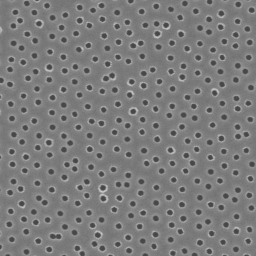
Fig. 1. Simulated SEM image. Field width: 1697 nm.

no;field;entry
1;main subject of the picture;a regular array of holes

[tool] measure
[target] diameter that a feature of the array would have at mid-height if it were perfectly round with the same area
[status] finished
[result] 36.6 nanometers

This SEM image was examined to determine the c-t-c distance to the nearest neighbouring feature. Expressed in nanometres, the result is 82.1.